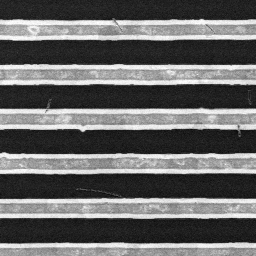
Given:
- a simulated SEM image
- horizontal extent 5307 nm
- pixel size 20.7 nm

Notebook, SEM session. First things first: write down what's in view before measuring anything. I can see parallel lines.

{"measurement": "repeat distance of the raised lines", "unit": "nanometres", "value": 925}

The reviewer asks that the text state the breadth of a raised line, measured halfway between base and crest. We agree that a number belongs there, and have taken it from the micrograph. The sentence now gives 321 nm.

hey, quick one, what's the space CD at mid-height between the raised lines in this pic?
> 0.604 microns